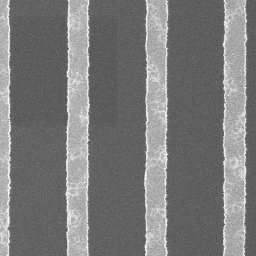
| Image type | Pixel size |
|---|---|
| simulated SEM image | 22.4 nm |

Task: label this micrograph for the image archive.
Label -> one or a few lines or trenches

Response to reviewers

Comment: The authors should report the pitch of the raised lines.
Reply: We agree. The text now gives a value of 78.4 px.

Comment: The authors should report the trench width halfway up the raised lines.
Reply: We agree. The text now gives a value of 1310 nanometres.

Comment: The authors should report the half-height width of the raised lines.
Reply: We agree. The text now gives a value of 450 nm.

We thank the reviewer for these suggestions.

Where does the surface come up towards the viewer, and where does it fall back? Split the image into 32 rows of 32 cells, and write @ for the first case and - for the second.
@--------@@-------@@@-------@@@-
@--------@@-------@@@-------@@@-
@--------@@-------@@@-------@@@-
@--------@@-------@@@-------@@@-
@--------@@-------@@@-------@@@-
@--------@@-------@@@-------@@@-
@--------@@-------@@@-------@@@-
@--------@@-------@@@-------@@@-
@--------@@-------@@@-------@@@-
@-------@@@-------@@@-------@@@-
@--------@@-------@@@-------@@@-
@--------@@-------@@@-------@@@-
@-------@@@-------@@@-------@@@-
@-------@@@-------@@@-------@@@-
@--------@@-------@@@-------@@@-
@-------@@@-------@@@-------@@@-
@-------@@@-------@@@-------@@@-
@-------@@@-------@@@-------@@@-
@-------@@@-------@@@-------@@@-
@-------@@@-------@@@-------@@@-
@-------@@@-------@@@-------@@@-
@-------@@@-------@@@-------@@@-
@-------@@@-------@@@-------@@@-
@-------@@@-------@@@-------@@@-
@-------@@@-------@@@-------@@@-
@-------@@@-------@@@-------@@@-
@-------@@@-------@@@-------@@@-
@-------@@@-------@@@-------@@@-
@-------@@@-------@@@-------@@@-
@-------@@@-------@@@-------@@@-
@-------@@@-------@@@-------@@@-
@-------@@@-------@@@-------@@--